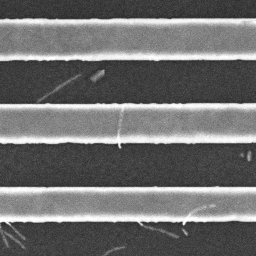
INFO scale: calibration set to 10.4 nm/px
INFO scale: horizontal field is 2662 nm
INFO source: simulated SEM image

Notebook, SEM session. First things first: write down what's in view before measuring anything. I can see lines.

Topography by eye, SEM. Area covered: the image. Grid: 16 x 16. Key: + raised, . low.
................
++++++++++++++++
++++++++++++++++
++++++++++++++++
................
................
.........+..++++
++++++++++++++++
++++++++++++++++
................
................
................
++++++++++++++++
++++++++++++++++
................
................